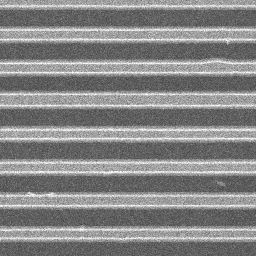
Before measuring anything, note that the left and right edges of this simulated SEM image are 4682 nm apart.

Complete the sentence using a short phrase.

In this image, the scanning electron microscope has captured parallel lines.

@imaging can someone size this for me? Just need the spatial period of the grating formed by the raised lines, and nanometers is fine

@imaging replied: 608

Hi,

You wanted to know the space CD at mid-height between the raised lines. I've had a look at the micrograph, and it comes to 361 nanometers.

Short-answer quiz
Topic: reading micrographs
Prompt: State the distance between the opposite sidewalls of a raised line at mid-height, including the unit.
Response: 245 nm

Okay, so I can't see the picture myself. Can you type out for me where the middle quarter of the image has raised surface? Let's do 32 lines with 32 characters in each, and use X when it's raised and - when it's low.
XXXXXXXXXXXXXXXXXXXXXXXXXXXXXXXX
XXXXXXXXXXXXXXXXXXXXXXXXXXXXXXXX
XXXXXXXXXXXXXXXXXXXXXXXXXXXXXXXX
--------------------------------
--------------------------------
--------------------------------
--------------------------------
XXXXXXXXXXXXXXXXXXXXXXXXXXXXXXXX
XXXXXXXXXXXXXXXXXXXXXXXXXXXXXXXX
XXXXXXXXXXXXXXXXXXXXXXXXXXXXXXXX
XXXXXXXXXXXXXXXXXXXXXXXXXXXXXXXX
--------------------------------
--------------------------------
--------------------------------
--------------------------------
--------------------------------
XXXXXXXXXXXXXXXXXXXXXXXXXXXXXXXX
XXXXXXXXXXXXXXXXXXXXXXXXXXXXXXXX
XXXXXXXXXXXXXXXXXXXXXXXXXXXXXXXX
--------------------------------
--------------------------------
--------------------------------
--------------------------------
--------------------------------
XXXXXXXXXXXXXXXXXXXXXXXXXXXXXXXX
XXXXXXXXXXXXXXXXXXXXXXXXXXXXXXXX
XXXXXXXXXXXXXXXXXXXXXXXXXXXXXXXX
----------XX--------------------
--------------------------------
--------------------------------
--------------------------------
--------------------------------